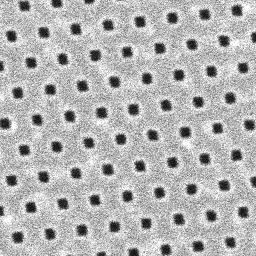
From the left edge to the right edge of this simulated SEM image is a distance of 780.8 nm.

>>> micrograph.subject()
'a regular array of holes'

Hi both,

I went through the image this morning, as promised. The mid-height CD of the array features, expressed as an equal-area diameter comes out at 36.8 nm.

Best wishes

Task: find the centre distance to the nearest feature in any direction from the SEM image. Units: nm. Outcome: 98.4